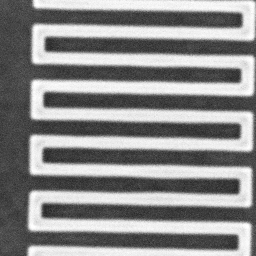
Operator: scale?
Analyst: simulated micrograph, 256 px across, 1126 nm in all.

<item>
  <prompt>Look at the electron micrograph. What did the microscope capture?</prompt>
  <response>groups of lines, slits or small figures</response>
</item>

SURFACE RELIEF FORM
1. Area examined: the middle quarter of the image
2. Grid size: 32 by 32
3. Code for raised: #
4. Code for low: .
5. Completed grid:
................................
................................
................................
................................
############....................
################################
################################
................................
................................
................................
................................
############...####.............
################################
################################
................................
................................
................................
................................
###############.................
################################
################################
................................
................................
................................
................................
############....................
################################
################################
................................
................................
................................
................................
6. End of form